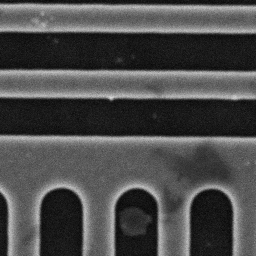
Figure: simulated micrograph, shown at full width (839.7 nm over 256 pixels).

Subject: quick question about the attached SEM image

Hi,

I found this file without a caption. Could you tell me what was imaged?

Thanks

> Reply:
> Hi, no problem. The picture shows groups of lines, slits or small figures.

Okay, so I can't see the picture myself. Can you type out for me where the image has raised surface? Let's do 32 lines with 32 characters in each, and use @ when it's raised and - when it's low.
--------------------------------
@@@@@@@@@@@@@@@@@@@@@@@@@@@@@@@@
@@@@@@@@@@@@@@@@@@@@@@@@@@@@@@@@
@@@@@@@@@@@@@@@@@@@@@@@@@@@@@@@@
--------------------------------
--------------------------------
--------------------------------
--------------------------------
--------------------------------
@@@@@@@@@@@@@@@@@@@@@@@@@@@@@@@@
@@@@@@@@@@@@@@@@@@@@@@@@@@@@@@@@
@@@@@@@@@@@@@@@@@@@@@@@@@@@@@@@@
--------------------------------
--------------------------------
--------------------------------
--------------------------------
--------------------------------
@@@@@@@@@@@@@@@@@@@@@@@@@@@@@@@@
@@@@@@@@@@@@@@@@@@@@@@@@@@@@@@@@
@@@@@@@@@@@@@@@@@@@@@@@@@@@@@@@@
@@@@@@@@@@@@@@@@@@@@@@@@@@@@@@@@
@@@@@@@@@@@@@@@@@@@@@@@@@@@@@@@@
@@@@@@@@@@@@@@@@@@@@@@@@@@@@@@@@
@@@@@@@-@@@@@@@@@@@@@@@@@@@@@@@@
@@@@@@----@@@@@----@@@@@----@@@@
-@@@@-----@@@@------@@@@-----@@@
-@@@@-----@@@@------@@@@-----@@@
-@@@@-----@@@@------@@@@-----@@@
-@@@@-----@@@@------@@@@-----@@@
-@@@@-----@@@@------@@@@-----@@@
-@@@@-----@@@@------@@@@-----@@@
-@@@@-----@@@@------@@@@-----@@@